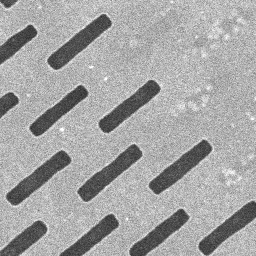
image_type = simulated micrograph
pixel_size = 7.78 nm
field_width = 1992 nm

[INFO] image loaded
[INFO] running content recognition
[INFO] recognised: holes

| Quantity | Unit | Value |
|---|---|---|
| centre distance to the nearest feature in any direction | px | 69.8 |